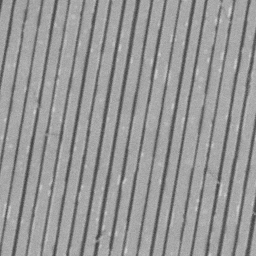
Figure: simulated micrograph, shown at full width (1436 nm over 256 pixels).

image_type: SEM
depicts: parallel lines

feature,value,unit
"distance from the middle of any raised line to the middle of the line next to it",76.2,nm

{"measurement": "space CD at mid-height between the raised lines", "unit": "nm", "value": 16.6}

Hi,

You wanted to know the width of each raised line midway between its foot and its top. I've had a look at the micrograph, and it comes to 55.3 nm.